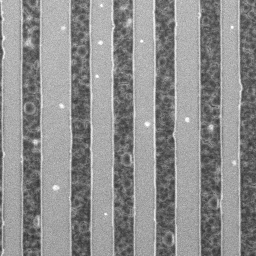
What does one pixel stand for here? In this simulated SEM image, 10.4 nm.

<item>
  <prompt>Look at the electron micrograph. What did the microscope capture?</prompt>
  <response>parallel lines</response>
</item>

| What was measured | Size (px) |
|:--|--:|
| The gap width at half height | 20.5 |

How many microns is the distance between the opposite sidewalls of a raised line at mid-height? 0.214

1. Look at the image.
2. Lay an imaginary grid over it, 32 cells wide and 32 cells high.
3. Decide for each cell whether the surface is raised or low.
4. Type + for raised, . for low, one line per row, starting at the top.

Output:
...++....++...+++..+++...+++..++
...++....++...+++..+++...+++..++
...++....++...++...+++...+++..++
...++....++...+++..+++...+++..++
...++....++...+++..+++...+++..++
....+....++...+++..+++...+++..++
+..++....++...+++..+++...+++..++
...++....++...+++..+++...+++..++
...++....++...+++..+++...+++..++
...++....++...+++..+++...+++..++
...++....++...+++..+++...+++..++
...++....++...+++..+++...+++..++
...++....++...+++..+++...+++..++
...++....++...+++..+++...+++..++
...++....++...+++..+++...+++..++
...++....++...+++..+++...+++..++
...++....++...+++..+++...+++..++
...+.....++...+++..+++...+++..++
...+.....++...+++..+++...+++..++
...++....++...+++..+++...+++..++
...++....++...+++..+++...+++..++
...++....++...+++..+++...+++..++
...++....++...+++..+++...+++..++
...++....++...+++..+++...+++..++
...++....++...+++..+++...+++..++
...++....++...+++..+++...+++..++
...++....++...+++..+++...+++..++
...++....++...+++..+++...+++..++
...++....++...+++..+++...+++..++
...++....++...+++..+++...+++..++
...++....++...+++..+++...+++..++
...++....++...+++..+++...+++..++